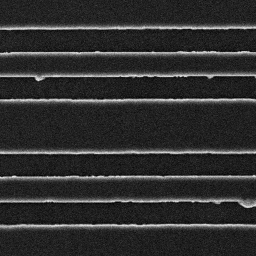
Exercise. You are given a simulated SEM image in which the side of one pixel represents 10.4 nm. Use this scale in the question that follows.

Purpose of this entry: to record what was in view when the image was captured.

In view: lines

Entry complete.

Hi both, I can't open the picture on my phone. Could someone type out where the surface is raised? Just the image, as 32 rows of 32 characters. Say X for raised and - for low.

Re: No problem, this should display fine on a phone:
XXXXXXXXXXXXXXXXXXXXXXXXXXXXXXXX
XXXXXXXXXXXXXXXXXXXXXXXXXXXXXXXX
XXXXXXXXXXXXXXXXXXXXXXXXXXXXXXXX
XXXXXXXXXXXXXXXXXXXXXXXXXXXXXXXX
--------------------------------
--------------------------------
-----------XX---------XXXXX--XXX
XXXXXXXXXXXXXXXXXXXXXXXXXXXXXXXX
XXXXXXXXXXXXXXXXXXXXXXXXXXXXXXXX
XXXXXXXXXXXXXXXXXXXXXXXX--------
--------------------------------
--------------------------------
---------------------X-XXXXXXXXX
XXXXXXXXXXXXXXXXXXXXXXXXXXXXXXXX
XXXXXXXXXXXXXXXXXXXXXXXXXXXXXXXX
XXXXXXXXXXXXXXXXXXXXXXXXXXXXXXXX
XXXXXXXXXXXXXXXXXXXXXXXXXXXXXXXX
XXXXXXXXXXXXXXXXXXXXXXXXXXXXXXXX
XXXXXXXXXXXXXXXXXXXXXXXXXXXXXXXX
--------------------------------
--------------------------------
--------------------------------
XXXXXXXXXXXXXXXXXXXXXXXXXXXXXXXX
XXXXXXXXXXXXXXXXXXXXXXXXXXXXXXXX
XXXXXXXXXXXXXXXXXXXXXXXXXXXXXXXX
------------------------------XX
--------------------------------
--------------------------------
XXXXXXXXXXXXXXXXXXXXXXXXXXXXXXXX
XXXXXXXXXXXXXXXXXXXXXXXXXXXXXXXX
XXXXXXXXXXXXXXXXXXXXXXXXXXXXXXXX
XXXXXXXXXXXXXXXXXXXXXXXXXXXXXXXX